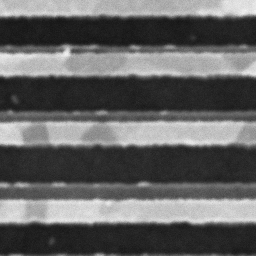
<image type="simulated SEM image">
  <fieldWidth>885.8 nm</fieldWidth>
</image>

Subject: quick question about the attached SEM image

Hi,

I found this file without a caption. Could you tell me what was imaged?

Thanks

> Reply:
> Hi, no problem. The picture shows lines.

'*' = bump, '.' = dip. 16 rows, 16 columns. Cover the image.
****************
................
................
****************
****************
................
................
****************
****************
................
................
**.*.....*......
****************
****************
................
................